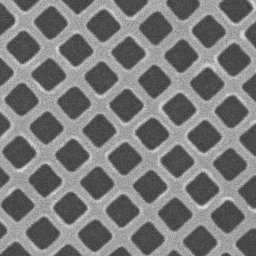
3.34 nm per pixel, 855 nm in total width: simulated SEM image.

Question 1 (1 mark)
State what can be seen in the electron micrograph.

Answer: a regular array of holes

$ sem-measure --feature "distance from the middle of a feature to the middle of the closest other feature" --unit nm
123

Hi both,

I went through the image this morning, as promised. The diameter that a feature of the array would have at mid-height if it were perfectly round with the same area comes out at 102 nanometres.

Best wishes